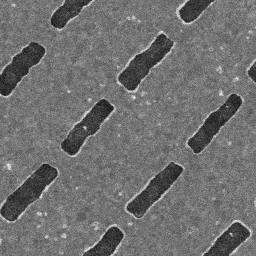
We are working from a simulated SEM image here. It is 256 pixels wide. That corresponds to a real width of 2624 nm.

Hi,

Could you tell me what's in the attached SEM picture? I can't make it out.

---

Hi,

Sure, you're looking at holes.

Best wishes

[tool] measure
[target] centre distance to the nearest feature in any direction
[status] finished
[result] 907 nanometers